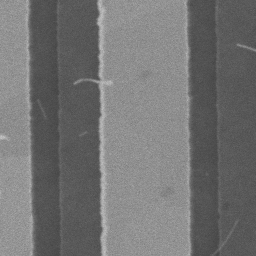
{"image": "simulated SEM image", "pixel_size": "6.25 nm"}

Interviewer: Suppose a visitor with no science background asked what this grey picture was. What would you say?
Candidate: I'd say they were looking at lines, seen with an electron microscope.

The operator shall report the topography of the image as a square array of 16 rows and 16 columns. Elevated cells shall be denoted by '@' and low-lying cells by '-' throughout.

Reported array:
@@----@@@@@@----
@@----@@@@@@----
@@----@@@@@@----
@@----@@@@@@----
@@----@@@@@@----
@@----@@@@@@----
@@----@@@@@@----
@@----@@@@@@----
@@----@@@@@@----
@@----@@@@@@----
@@----@@@@@@----
@@----@@@@@@----
@@----@@@@@@----
@@----@@@@@@----
@@----@@@@@@----
@@----@@@@@@----